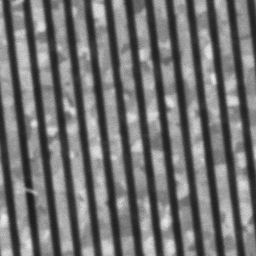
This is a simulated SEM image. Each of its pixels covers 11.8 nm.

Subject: parallel lines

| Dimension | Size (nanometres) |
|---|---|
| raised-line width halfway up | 143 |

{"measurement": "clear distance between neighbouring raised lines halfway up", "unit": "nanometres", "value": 92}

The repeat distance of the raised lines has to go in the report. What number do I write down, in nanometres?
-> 238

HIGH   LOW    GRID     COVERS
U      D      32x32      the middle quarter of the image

UUDDUUUDDUUUDDUUUDDUUUDDUUUDDDUU
UUDDUUUDDUUUDDUUUDDUUUDDUUUDDDUU
UUDDUUUDDUUUDDUUUDDUUUDDDUUDDDUU
UUDDUUUDDUUUDDUUUDDDUUUDDUUUDDUU
UUDDUUUDDUUUDDDUUUDDUUUDDUUUDDUU
UUDDDUUDDDUUDDDUUUDDUUUDDUUUDDUU
UUDDDUUUDDUUUDDUUUDDUUUDDUUUDDUU
UUDDDUUUDDUUUDDUUUDDUUUDDUUUDDUU
UUUDDUUUDDUUUDDUUUDDUUUDDUUUDDDU
UUUDDUUUDDUUUDDUUUDDUUUDDUUUDDDU
UUUDDUUUDDUUUDDUUUDDUUUDDDUUDDDU
UUUDDUUUDDUUUDDDUUDDDUUUDDUUUDDU
UUUDDUUUDDUUUDDDUUUDDUUUDDUUUDDU
UUUDDDUUDDDUUDDDUUUDDUUUDDUUUDDU
UUUDDDUUUDDUUUDDUUUDDUUUDDUUUDDU
DUUDDDUUUDDUUUDDUUUDDUUUDDUUUDDU
DUUUDDUUUDDUUUDDUUUDDUUUDDUUUDDU
DUUUDDUUUDDUUUDDUUUDDUUUDDUUUDDD
DUUUDDUUUDDUUUDDUUUDDUUUDDUUUDDD
DUUUDDUUUDDUUUDDDUUDDDUUDDDUUUDD
DUUUDDUUUDDUUUDDDUUUDDUUUDDUUUDD
DUUUDDDUUDDDUUDDDUUUDDUUUDDUUUDD
DUUUDDDUUUDDUUUDDUUUDDUUUDDUUUDD
DDUUDDDUUUDDUUUDDUUUDDUUUDDUUUDD
DDUUUDDUUUDDUUUDDUUUDDUUUDDUUUDD
DDUUUDDUUUDDUUUDDUUUDDUUUDDUUUDD
DDUUUDDUUUDDUUUDDUUUDDUUUDDUUUDD
DDUUUDDUUUDDUUUDDDUUDDDUUDDDUUUD
DDUUUDDUUUDDUUUDDDUUUDDUUUDDUUUD
DDUUUDDDUUDDDUUDDDUUUDDUUUDDUUUD
DDUUUDDDUUUDDUUUDDUUUDDUUUDDUUUD
DDDUUDDDUUUDDUUUDDUUUDDUUUDDUUUD